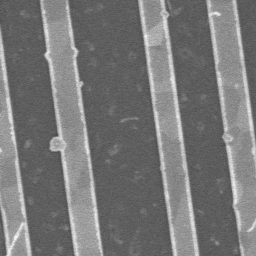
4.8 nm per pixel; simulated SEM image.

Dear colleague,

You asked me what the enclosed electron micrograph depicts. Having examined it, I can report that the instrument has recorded one or a few lines or trenches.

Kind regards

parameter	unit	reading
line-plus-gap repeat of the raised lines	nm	410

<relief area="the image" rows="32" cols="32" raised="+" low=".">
.....++++........+++......+++...
.....++++.........+++.....++++..
.....++++.........+++.....++++..
......+++.........+++.....++++..
......+++.........+++.....++++..
......+++.........+++......+++..
......++++........+++......+++..
......+++.........+++......+++..
+.....++++.........+++.....++++.
+.....++++.........+++.....++++.
+.....++++.........+++.....++++.
+......+++.........+++.....++++.
+......+++.........+++.....++++.
+......+++.........+++......+++.
+......+++.........+++......+++.
++.....++++........++++.....++++
++.....++++.........+++.....++++
++....+++++.........+++.....++++
++....+++++.........+++.....++++
++......+++.........+++.....++++
++......+++.........+++......+++
++......++++........+++......+++
+++.....++++........+++......+++
+++.....++++.........+++.....+++
+++.....++++.........+++.....+++
+++......+++.........+++.....+++
+++......+++.........+++.....+++
+++......+++.........+++......++
.++......+++.........+++......++
.++......+++.........+++......++
.+++.....++++.........+++.....++
.+++.....++++.........+++.....++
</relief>